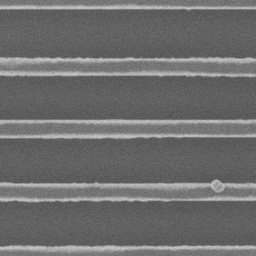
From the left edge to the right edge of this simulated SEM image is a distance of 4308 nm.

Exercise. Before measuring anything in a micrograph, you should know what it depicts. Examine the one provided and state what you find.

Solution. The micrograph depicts lines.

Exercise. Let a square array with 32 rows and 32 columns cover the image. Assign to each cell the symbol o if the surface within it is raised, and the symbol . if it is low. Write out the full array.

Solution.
oooooooooooooooooooooooooooooooo
................................
................................
................................
................................
................................
................................
o...oooooooooooooooooooooooooooo
oooooooooooooooooooooooooooooooo
................................
................................
................................
................................
................................
................................
oooooooooooooooooooooooooooooooo
oooooooooooooooooooooooooooooooo
................................
................................
................................
................................
................................
................................
oooooooooooooooooooooooooooooooo
oooooooooooooooooooooooooooooooo
................................
................................
................................
................................
................................
................................
oooooooooooooooooooooooooooooooo